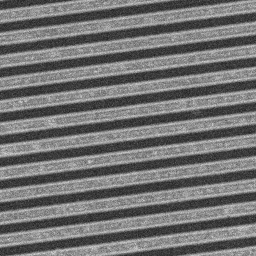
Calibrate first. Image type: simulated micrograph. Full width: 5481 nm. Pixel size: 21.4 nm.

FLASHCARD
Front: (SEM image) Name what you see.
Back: parallel lines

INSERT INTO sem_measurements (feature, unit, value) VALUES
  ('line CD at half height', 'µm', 0.236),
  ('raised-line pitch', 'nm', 476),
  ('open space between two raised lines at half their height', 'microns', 0.255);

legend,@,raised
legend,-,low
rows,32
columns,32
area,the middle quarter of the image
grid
---------@@@@@@@@@@@@@@@@@@-----
-@@@@@@@@@@@@@@@@@@@@-----------
@@@@@@@@@@@@@@------------------
@@@@@@----------------------@@@@
---------------------@@@@@@@@@@@
-------------@@@@@@@@@@@@@@@@@@@
-----@@@@@@@@@@@@@@@@@@@@@------
@@@@@@@@@@@@@@@@@@--------------
@@@@@@@@@@----------------------
@------------------------@@@@@@@
------------------@@@@@@@@@@@@@@
----------@@@@@@@@@@@@@@@@@@@@--
--@@@@@@@@@@@@@@@@@@@@----------
@@@@@@@@@@@@@@@-----------------
@@@@@@@----------------------@@@
----------------------@@@@@@@@@@
--------------@@@@@@@@@@@@@@@@@@
-------@@@@@@@@@@@@@@@@@@@@-----
@@@@@@@@@@@@@@@@@@@-------------
@@@@@@@@@@@---------------------
@@@@------------------------@@@@
--------------------@@@@@@@@@@@@
-------------@@@@@@@@@@@@@@@@@@-
-----@@@@@@@@@@@@@@@@@@---------
@@@@@@@@@@@@@@@@----------------
@@@@@@@@------------------------
@------------------------@@@@@@@
-----------------@@@@@@@@@@@@@@@
---------@@@@@@@@@@@@@@@@@@@----
--@@@@@@@@@@@@@@@@@@------------
@@@@@@@@@@@@@-------------------
@@@@@------------------------@@@